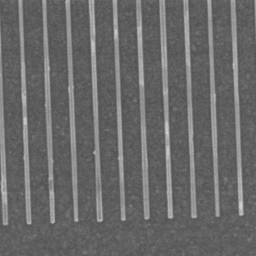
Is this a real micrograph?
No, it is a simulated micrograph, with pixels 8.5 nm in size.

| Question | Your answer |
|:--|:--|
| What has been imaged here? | parallel lines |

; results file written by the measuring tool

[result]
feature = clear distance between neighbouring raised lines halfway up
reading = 166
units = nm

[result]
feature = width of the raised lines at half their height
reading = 35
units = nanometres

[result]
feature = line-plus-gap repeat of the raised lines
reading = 200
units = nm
